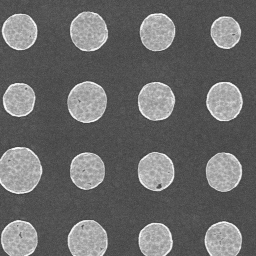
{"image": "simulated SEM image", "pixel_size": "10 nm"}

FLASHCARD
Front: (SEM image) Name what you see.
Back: a regular array of raised bodies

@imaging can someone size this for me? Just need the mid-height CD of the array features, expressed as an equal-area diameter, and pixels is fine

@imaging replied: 36.6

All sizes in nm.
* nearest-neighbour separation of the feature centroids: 682